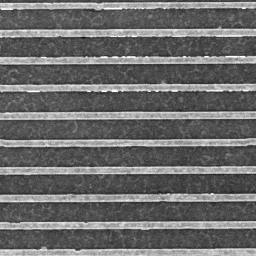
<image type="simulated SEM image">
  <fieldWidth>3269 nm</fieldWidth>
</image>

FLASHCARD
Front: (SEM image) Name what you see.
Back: parallel lines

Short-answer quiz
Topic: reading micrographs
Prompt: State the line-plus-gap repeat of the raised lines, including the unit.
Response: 0.351 um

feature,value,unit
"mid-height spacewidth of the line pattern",0.27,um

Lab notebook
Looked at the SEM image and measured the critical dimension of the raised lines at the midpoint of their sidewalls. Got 75 nanometres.